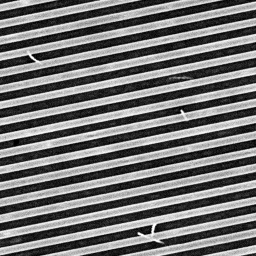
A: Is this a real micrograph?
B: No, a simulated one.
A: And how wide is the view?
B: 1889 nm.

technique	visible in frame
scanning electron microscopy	parallel lines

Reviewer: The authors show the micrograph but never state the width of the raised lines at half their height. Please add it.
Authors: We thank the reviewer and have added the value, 0.0552 um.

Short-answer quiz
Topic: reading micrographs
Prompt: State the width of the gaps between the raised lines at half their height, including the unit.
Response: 61.5 nm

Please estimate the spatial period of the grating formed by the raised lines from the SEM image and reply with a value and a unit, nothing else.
0.117 microns